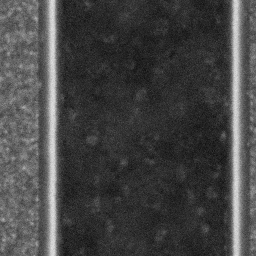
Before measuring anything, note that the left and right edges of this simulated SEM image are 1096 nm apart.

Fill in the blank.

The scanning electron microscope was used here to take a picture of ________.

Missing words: one or a few lines or trenches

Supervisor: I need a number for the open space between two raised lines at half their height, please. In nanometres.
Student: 781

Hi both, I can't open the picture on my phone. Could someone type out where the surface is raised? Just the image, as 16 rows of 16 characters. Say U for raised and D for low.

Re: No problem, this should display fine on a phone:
UUUDDDDDDDDDDDDU
UUUDDDDDDDDDDDDU
UUUDDDDDDDDDDDDU
UUUDDDDDDDDDDDDU
UUUDDDDDDDDDDDDU
UUUDDDDDDDDDDDDU
UUUDDDDDDDDDDDDU
UUUDDDDDDDDDDDDU
UUUDDDDDDDDDDDDU
UUUDDDDDDDDDDDDU
UUUDDDDDDDDDDDDU
UUUDDDDDDDDDDDDU
UUUDDDDDDDDDDDDU
UUUDDDDDDDDDDDDU
UUUDDDDDDDDDDDDU
UUUDDDDDDDDDDDDU